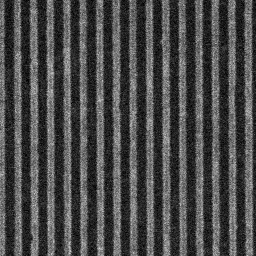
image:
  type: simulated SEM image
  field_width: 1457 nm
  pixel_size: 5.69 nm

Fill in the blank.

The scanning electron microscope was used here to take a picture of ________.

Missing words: parallel lines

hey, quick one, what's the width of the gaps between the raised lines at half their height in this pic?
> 61.9 nm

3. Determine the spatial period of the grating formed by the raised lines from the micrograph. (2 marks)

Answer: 93.9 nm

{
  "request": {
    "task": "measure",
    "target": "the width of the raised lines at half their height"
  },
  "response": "0.0334 microns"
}